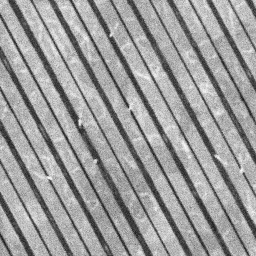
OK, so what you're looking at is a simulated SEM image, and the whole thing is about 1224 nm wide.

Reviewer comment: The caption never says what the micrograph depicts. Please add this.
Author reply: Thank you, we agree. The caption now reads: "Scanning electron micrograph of parallel lines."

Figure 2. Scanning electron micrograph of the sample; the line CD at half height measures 58.9 nm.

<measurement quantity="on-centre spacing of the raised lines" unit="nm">83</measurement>